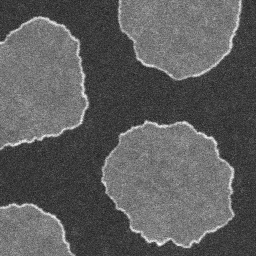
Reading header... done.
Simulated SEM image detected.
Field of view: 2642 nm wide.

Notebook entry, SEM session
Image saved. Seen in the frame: raised bodies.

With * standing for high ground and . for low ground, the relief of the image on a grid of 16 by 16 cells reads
.......********.
..**...********.
*****...*******.
*****....*****..
*****.....***...
*****...........
*****...........
*****...........
***.....*****...
.......*******..
......********..
.......*******..
.......*******..
***.....******..
****.....****...
****............